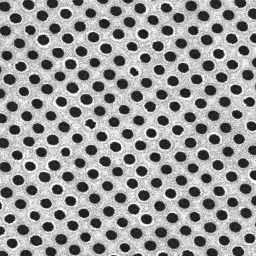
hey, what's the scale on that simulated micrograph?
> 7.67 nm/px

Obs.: a regular array of holes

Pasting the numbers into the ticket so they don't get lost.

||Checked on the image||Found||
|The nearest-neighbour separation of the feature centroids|0.129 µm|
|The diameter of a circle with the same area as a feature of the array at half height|86.1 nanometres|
